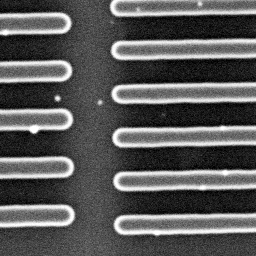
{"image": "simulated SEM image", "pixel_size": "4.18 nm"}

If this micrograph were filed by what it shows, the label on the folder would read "groups of lines, slits or small figures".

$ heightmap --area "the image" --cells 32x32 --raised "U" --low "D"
DDDDDDDDDDDDDDUUUUUUUUUUUUUUUUUU
DDDDDDDDDDDDDDUUUUUUUUUUUUUUUUUU
UUUUUUUUUDDDDDDDDDDDDDDDDDDDDDDD
UUUUUUUUUDDDDDDDDDDDDDDDDDDDDDDD
DDDDDDDDDDDDDDDDDDDDDDDDDDDDDDDD
DDDDDDDDDDDDDDDUUUUUUUUUUUUUUUUU
DDDDDDDDDDDDDDUUUUUUUUUUUUUUUUUU
DDDDDDDDDDDDDDDDDDDDDDDDDDDDDDDD
UUUUUUUUUDDDDDDDDDDDDDDDDDDDDDDD
UUUUUUUUUDDDDDDDDDDDDDDDDDDDDDDD
DDDDDDDDDDDDDDDDDDDDDDDDDDDDDDDD
DDDDDDDDDDDDDDUUUUUUUUUUUUUUUUUU
DDDDDDDDDDDDDDDUUUUUUUUUUUUUUUUU
DDDDDDDDDDDDDDDDDDDDDDDDDDDDDDDD
UUUUUUUUUDDDDDDDDDDDDDDDDDDDDDDD
UUUUUUUUUDDDDDDDDDDDDDDDDDDDDDDD
DDDDDDDDDDDDDDDUUUUUUUUUUUUUUUUU
DDDDDDDDDDDDDDUUUUUUUUUUUUUUUUUU
DDDDDDDDDDDDDDDDDDDDDDDDDDDDDDDD
DDDDDDDDDDDDDDDDDDDDDDDDDDDDDDDD
UUUUUUUUUDDDDDDDDDDDDDDDDDDDDDDD
UUUUUUUUUDDDDDDDDDDDDDDDUUUUUUUU
DDDDDDDDDDDDDDUUUUUUUUUUUUUUUUUU
DDDDDDDDDDDDDDDUUUUUUUUUUUUUUUUD
DDDDDDDDDDDDDDDDDDDDDDDDDDDDDDDD
DDDDDDDDDDDDDDDDDDDDDDDDDDDDDDDD
UUUUUUUUUDDDDDDDDDDDDDDDDDDDDDDD
UUUUUUUUUDDDDDDUUUUUUUUUUUUUUUUU
DDDDDDDDDDDDDDDUUUUUUUUUUUUUUUUU
DDDDDDDDDDDDDDDDDDDDDDDDDDDDDDDD
DDDDDDDDDDDDDDDDDDDDDDDDDDDDDDDD
DDDDDDDDDDDDDDDDDDDDDDDDDDDDDDDD